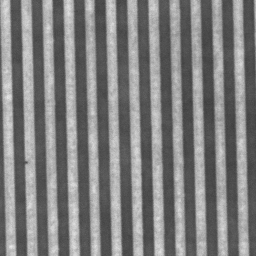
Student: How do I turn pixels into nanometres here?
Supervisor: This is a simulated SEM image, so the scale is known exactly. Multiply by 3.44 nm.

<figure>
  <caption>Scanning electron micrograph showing parallel lines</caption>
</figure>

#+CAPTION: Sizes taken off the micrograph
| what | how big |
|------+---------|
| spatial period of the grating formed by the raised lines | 72.8 nanometers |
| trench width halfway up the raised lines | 40.4 nanometres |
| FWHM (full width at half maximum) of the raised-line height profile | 31 nm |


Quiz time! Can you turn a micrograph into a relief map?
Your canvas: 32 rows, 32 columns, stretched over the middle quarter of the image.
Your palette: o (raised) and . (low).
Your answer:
ooo...oo...oo....oo...oo...oo...
.oo...oo...oo....oo...oo...oo...
.oo...oo...oo....oo...oo...oo...
.oo...oo...oo....oo...oo...oo...
.oo...oo...oo....oo...oo...oo...
.oo...oo...oo....oo...oo...oo...
.oo...oo...oo....oo...oo...oo...
.oo...oo...oo...ooo...oo...oo...
.oo...oo...oo...ooo...oo...oo...
.oo...oo...oo...ooo...oo...oo...
.oo...oo...oo....oo...oo...oo...
.oo...oo...oo....oo...oo...oo...
.oo...oo...oo....oo...oo...oo...
.oo...oo...oo....oo...oo...oo...
.oo...oo...oo....oo...oo...oo...
.oo...oo...oo....oo...oo...oo...
.oo...oo...ooo...oo...oo...ooo..
.oo...oo....oo...oo...oo...ooo..
.oo...oo....oo...oo...oo...ooo..
.oo...oo....oo...oo...oo...ooo..
.oo...oo....oo...oo...oo...ooo..
.oo...oo....oo...oo...oo...ooo..
.oo...oo....oo...oo...oo...ooo..
.oo...oo....oo...oo...oo...ooo..
.oo...ooo...oo...oo...oo...ooo..
.oo...ooo...oo...oo...oo...ooo..
.oo...ooo...oo...oo...oo....oo..
.oo...ooo...oo...oo...oo....oo..
.oo...ooo...oo...oo...oo....oo..
.oo...ooo...oo...oo...oo....oo..
.oo...ooo...oo...oo...oo....oo..
.oo...ooo...oo...oo...oo....oo..